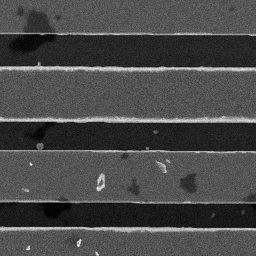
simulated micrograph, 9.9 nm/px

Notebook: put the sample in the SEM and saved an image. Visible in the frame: lines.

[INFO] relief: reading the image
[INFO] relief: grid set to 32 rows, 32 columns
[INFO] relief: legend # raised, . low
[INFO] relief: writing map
################################
################################
################################
################################
................................
................................
................................
................................
###############.....#...........
################################
################################
################################
################################
################################
################################
................................
................................
................................
................................
################################
################################
################################
################################
################################
################################
................................
................................
................................
###################.##..........
################################
################################
################################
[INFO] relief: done